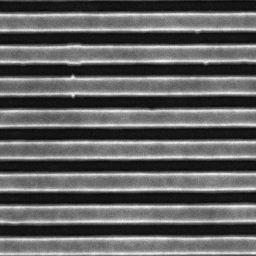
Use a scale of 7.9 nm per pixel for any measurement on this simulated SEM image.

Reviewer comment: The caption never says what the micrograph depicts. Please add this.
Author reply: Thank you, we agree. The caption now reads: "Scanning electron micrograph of parallel lines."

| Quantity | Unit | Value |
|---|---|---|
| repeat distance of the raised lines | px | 32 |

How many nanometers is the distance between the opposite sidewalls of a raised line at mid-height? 147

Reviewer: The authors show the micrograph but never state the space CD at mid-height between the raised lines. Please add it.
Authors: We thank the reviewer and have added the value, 109 nm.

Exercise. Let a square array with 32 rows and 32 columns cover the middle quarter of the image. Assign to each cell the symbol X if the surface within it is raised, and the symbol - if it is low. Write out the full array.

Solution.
--------------------------------
--------------------------------
--------------------------------
XXXXXXXXXXXXXX--XXXXXXXXXXXXXXXX
XXXXXXXXXXXXXXXXXXXXXXXXXXXXXXXX
XXXXXXXXXXXXXXXXXXXXXXXXXXXXXXXX
XXXXXXXXXXXXXXXXXXXXXXXXXXXXXXXX
XXXXXXXXXXXXXXXXXXXXXXXXXXXXXXXX
--------------------------------
--------------------------------
--------------------------------
XXXXXXXXXXXXXXXXXXXXXXXXXXXXXXX-
XXXXXXXXXXXXXXXXXXXXXXXXXXXXXXXX
XXXXXXXXXXXXXXXXXXXXXXXXXXXXXXXX
XXXXXXXXXXXXXXXXXXXXXXXXXXXXXXXX
XXXXXXXXXXXXXXXXXXXXX---X-----XX
--------------------------------
--------------------------------
--------------------------------
XXXXXXXXXXXXXXXXXXXXXXXXXXXXXXXX
XXXXXXXXXXXXXXXXXXXXXXXXXXXXXXXX
XXXXXXXXXXXXXXXXXXXXXXXXXXXXXXXX
XXXXXXXXXXXXXXXXXXXXXXXXXXXXXXXX
XXXXXXXXXXXXXXXXXXXXXXXXXXXXXXXX
--------------------------------
--------------------------------
--------------------------------
XXXXXXXXXXXXXXXXXXXXXXXXXXXXXXXX
XXXXXXXXXXXXXXXXXXXXXXXXXXXXXXXX
XXXXXXXXXXXXXXXXXXXXXXXXXXXXXXXX
XXXXXXXXXXXXXXXXXXXXXXXXXXXXXXXX
XXXXXXXXXXXXXXXXXXXXXXXXXXXXXXXX